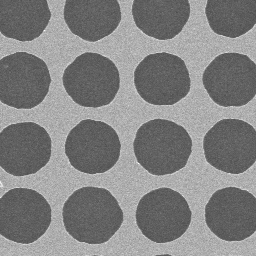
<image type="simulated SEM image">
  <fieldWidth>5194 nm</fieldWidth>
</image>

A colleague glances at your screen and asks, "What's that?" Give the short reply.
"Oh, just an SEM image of holes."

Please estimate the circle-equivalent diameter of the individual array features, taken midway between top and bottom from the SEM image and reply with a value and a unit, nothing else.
1130 nm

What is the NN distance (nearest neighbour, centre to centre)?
67.7 px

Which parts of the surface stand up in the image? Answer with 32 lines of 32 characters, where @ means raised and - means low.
------@@-------@@-------@@------
------@@-------@@-------@@------
------@@-------@@------@@@------
------@@@------@@------@@@-----@
@----@@@@@---@@@@@@---@@@@@@--@@
@@@@@@@@@@@@@@@@@@@@@@@@@@@@@@@@
@@-@@@@@@@@@@@@@@@@@@@@@@@@@@@@@
-----@@@@-----@@@@-----@@@@----@
------@@-------@@------@@@------
------@@-------@@-------@-------
------@@-------@@-------@-------
------@@-------@@-------@@------
-----@@@@-----@@@@-----@@@@----@
@@--@@@@@@@@@@@@@@@@@@@@@@@@@@@@
@@@@@@@@@@@@@@@@@@@@@@@@@@@@@@@@
@@---@@@@@---@@@@@----@@@@@----@
------@@@-----@@@------@@@------
------@@-------@@-------@-------
------@@-------@@-------@-------
------@@-------@@-------@@------
------@@@-----@@@------@@@------
@----@@@@@---@@@@@@---@@@@@@--@@
@@@@@@@@@@@@@@@@@@@@@@@@@@@@@@@@
@@-@@@@@@@---@@@@@@@-@@@@@@@--@@
-----@@@@-----@@@@-----@@@------
------@@-------@@------@@@------
------@@-------@@-------@@------
------@@-------@@-------@@------
------@@-------@@------@@@------
-----@@@@-----@@@@-----@@@@----@
@@@@@@@@@@@@@@@@@@@@@@@@@@@@@@@@
@@@@@@@@@@@@@@@@@@@@@@@@@@@@@@@@